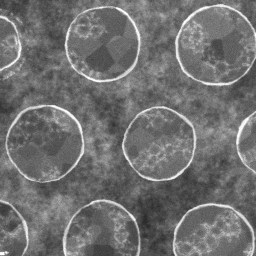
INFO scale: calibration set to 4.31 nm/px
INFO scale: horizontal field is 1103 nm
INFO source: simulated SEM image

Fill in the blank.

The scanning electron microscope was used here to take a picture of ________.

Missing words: raised bodies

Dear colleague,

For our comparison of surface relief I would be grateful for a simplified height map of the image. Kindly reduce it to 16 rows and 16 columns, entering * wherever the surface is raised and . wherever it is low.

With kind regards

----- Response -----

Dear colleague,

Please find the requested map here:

......*......*..
*...****....****
*...*****..*****
*...*****..*****
.....***....***.
................
................
.****...****...*
*****...****...*
*****...****...*
.****...****....
................
................
*....***....***.
**..*****..*****
**..*****..*****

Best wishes